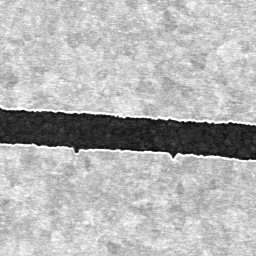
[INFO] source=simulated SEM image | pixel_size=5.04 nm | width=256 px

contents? one or a few lines or trenches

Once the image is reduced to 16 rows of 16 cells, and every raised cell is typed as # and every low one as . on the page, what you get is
################
################
################
################
################
################
################
...........#####
................
#########.......
################
################
################
################
################
################